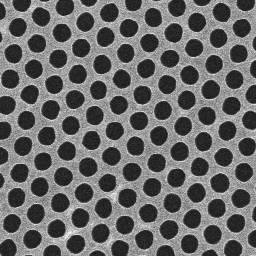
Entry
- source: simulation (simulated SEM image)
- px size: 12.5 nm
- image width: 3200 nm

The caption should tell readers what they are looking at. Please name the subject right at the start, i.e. a regular array of holes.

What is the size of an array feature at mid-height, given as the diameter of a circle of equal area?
233 nm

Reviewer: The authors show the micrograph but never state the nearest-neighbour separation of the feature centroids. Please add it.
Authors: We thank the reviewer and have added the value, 315 nanometers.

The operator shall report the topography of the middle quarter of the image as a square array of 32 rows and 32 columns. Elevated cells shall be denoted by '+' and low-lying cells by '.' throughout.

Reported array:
++...++.....++++++.....++...+++.
++...+++....+..+++.....+++++++..
+.....+++.+++...+++...+++++++...
+.....++++++.....+++.+++....+...
++...++...++.....+++++++....++..
+++++++...+++...+++.++++....++++
++++++.....+++++++....++....++++
+....++....++++++.....+++.+++...
.....++...++...+++....++++++....
.....++++++.....++...+++..++....
+...+++.+++.....+++++++....++...
++++++...+++...++++++++....+++++
+++++.....+++.+++...+++....+++++
...++.....++++++.....++...+++..+
....++...+++.++++....+++++++....
....+++++++...+++....++++++.....
....++++++.....+++.+++....++....
+..++....+.....++++++.....++...+
+++++....++...+++..+++....++++++
..++.....+++++++....++...+++++++
...++....++++++.....+++++++....+
...+++++++....++....+++++++....+
...+++++++....++...+++..+++....+
...++..++.....+++++++....++....+
++++....++....+++++++....+++++++
++++....+++++++....++....+++++++
.+++....+++++++....+++...++..+++
..++....+++++++....+++++++....++
..+++++++....++....+++++++....++
..+++++++....+++++++....++....++
++++..+++....+++++++....+++..+++
+++....++...+++..+++....+++++++.